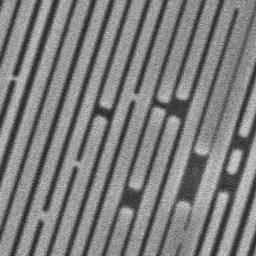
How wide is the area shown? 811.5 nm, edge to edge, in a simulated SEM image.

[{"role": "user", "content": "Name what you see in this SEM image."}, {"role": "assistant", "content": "parallel lines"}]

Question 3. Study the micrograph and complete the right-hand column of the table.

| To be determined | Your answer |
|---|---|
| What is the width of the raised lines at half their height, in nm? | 41.1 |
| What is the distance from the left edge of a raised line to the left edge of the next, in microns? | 0.0554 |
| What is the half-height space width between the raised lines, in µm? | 0.0147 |